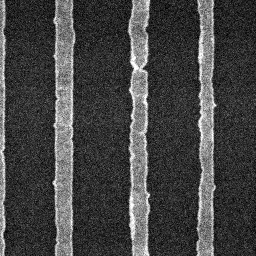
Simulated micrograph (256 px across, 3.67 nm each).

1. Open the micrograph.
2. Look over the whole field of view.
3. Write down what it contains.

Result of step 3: one or a few lines or trenches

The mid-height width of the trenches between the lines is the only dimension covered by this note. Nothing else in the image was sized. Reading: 196 nm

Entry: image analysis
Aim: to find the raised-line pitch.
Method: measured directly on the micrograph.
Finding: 261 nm